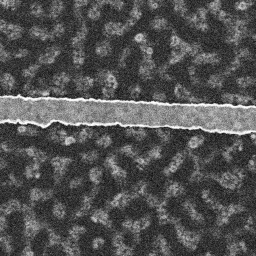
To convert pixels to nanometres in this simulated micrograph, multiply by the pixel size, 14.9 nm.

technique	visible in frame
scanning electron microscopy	one or a few lines or trenches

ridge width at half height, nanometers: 359